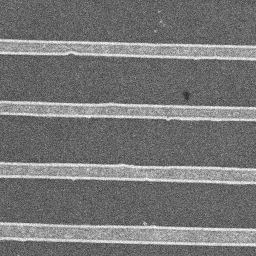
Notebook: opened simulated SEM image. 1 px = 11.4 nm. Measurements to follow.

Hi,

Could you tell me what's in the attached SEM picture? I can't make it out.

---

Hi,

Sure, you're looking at parallel lines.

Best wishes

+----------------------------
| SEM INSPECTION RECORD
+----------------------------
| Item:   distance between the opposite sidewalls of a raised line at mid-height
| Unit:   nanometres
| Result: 142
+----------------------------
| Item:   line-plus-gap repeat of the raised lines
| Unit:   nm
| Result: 702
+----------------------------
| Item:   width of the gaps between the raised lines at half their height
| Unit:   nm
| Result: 561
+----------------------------